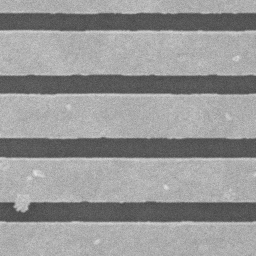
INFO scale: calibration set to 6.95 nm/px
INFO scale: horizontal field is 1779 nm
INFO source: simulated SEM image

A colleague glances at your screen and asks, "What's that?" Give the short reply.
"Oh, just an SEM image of lines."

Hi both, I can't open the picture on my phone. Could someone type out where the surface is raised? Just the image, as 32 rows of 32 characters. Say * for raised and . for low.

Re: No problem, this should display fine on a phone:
********************************
********************************
................................
................................
********************************
********************************
********************************
********************************
********************************
................................
................................
................................
********************************
********************************
********************************
********************************
********************************
................................
................................
................................
********************************
********************************
********************************
********************************
********************************
..**............................
................................
................................
********************************
********************************
********************************
********************************